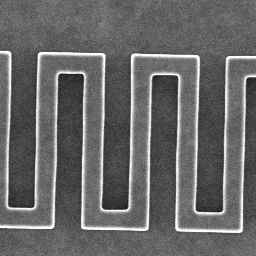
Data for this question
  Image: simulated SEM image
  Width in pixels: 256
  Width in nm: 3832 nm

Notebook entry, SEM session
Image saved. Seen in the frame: groups of lines, slits or small figures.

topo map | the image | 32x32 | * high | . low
................................
................................
................................
................................
................................
................................
*...............................
*....********...*********...****
*....********...*********...****
*....**...***...***...***...****
*....**....**...***...***...***.
*....**...***...***...***...***.
*....**...***...***...***...***.
*....**...***...***...***...***.
*....**...***...***...***...***.
*....**...***...***...***...***.
*....**...***...***...***...**..
*....**...***...***...***...**..
*....**...***...***...***...**..
*...***...***...***...***...**..
*...***...***...***...**....**..
*...***...***...***...**....**..
*...***...***...***...**....**..
*...***...***...***...**....**..
*...***...***...***...**....**..
*...***...***...***...**....**..
*******...********....***...**..
*******...********....********..
...........*******....********..
................................
................................
................................